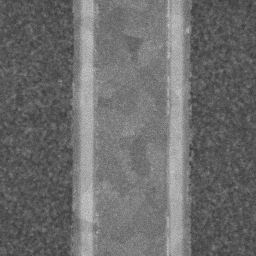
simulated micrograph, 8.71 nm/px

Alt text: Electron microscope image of one or a few lines or trenches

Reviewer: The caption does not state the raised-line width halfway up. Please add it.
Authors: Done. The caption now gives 777 nanometres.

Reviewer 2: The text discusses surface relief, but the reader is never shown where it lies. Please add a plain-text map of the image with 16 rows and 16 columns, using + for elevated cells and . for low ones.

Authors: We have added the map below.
......+++++.....
.....++++++.....
.....++++++.....
.....++++++.....
.....++++++.....
.....++++++.....
.....++++++.....
.....++++++.....
.....++++++.....
.....++++++.....
.....++++++.....
.....++++++.....
.....++++++.....
.....++++++.....
.....++++++.....
.....++++++.....